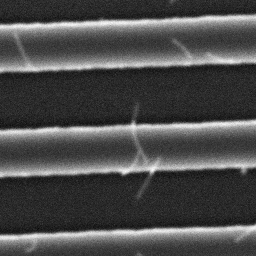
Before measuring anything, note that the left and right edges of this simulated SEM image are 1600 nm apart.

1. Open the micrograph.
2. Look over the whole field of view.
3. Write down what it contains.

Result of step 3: lines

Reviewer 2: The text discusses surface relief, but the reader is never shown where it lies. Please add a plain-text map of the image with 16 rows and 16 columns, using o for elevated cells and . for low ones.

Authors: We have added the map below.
................
...ooooooooooooo
oooooooooooooooo
oooooooooooooooo
................
................
................
................
oooooooooooooooo
oooooooooooooooo
ooooooooooooo...
................
................
................
.......ooooooooo
oooooooooooooooo